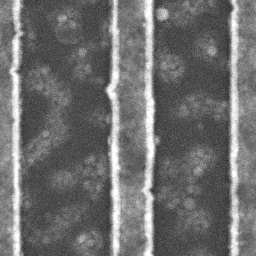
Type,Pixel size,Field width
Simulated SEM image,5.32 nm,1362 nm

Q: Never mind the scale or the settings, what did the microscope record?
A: one or a few lines or trenches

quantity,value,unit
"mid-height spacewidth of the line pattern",479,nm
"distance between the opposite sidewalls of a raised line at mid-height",187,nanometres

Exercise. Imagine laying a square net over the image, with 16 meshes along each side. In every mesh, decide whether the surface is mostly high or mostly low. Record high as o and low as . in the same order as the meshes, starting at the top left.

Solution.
o......oo......o
o......oo......o
o......oo......o
o......oo......o
o......oo......o
o......oo......o
o......oo......o
o......oo......o
o......oo......o
o......oo......o
o......oo......o
o......oo......o
o......oo......o
o......oo......o
o......oo......o
o......oo......o